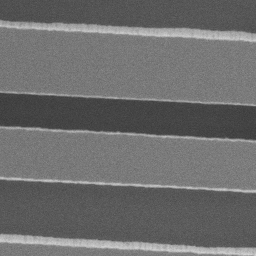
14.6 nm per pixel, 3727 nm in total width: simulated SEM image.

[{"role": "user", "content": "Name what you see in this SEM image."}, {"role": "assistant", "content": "lines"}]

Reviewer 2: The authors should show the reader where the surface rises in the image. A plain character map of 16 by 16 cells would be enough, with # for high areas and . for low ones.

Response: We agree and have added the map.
................
................
################
################
################
################
..............##
................
##########......
################
################
......##########
................
................
................
##########......